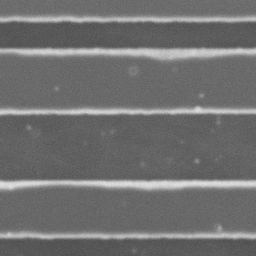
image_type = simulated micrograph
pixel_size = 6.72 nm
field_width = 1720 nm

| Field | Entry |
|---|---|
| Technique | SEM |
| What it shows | lines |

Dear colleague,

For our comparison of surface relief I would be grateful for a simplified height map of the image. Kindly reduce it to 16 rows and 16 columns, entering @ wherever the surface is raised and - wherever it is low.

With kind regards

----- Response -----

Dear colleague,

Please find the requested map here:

@@@@@@@@@@@@@@@@
----------------
----------------
@@@@@@@@@@@@@@@@
@@@@@@@@@@@@@@@@
@@@@@@@@@@@@@@@@
@@@@@@@@@@@@@@@@
----------------
----------------
----------------
----------------
-@@@@@@@@-@@@@@@
@@@@@@@@@@@@@@@@
@@@@@@@@@@@@@@@@
@@@@@@@@@@@@@@@@
----------------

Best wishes